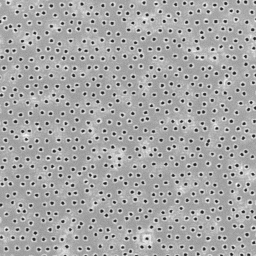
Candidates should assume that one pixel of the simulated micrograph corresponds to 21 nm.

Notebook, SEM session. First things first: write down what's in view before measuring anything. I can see a regular array of holes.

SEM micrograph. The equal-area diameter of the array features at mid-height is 74.8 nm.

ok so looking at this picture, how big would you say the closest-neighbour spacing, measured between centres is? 167 nm